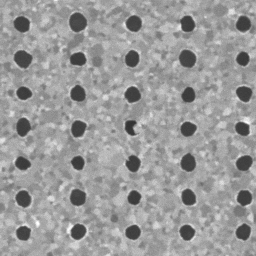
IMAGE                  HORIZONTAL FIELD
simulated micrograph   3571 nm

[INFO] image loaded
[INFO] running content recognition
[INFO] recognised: a regular array of holes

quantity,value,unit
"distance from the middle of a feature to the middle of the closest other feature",480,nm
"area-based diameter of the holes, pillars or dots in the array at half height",0.224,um